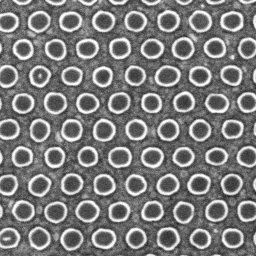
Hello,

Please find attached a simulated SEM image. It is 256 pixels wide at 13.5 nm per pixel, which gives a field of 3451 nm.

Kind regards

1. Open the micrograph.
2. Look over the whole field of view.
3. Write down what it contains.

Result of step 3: a regular array of raised bodies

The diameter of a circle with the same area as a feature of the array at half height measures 267 nanometres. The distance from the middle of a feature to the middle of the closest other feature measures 31 px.